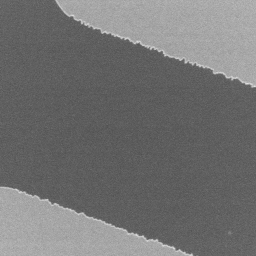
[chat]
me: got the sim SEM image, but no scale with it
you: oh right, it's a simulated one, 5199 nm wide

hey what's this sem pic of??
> one or a few lines or trenches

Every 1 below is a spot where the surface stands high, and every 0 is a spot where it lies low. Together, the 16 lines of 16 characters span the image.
0000111111111111
0000011111111111
0000000011111111
0000000000011111
0000000000000011
0000000000000000
0000000000000000
0000000000000000
0000000000000000
0000000000000000
0000000000000000
0000000000000000
1110000000000000
1111100000000000
1111111100000000
1111111111100000